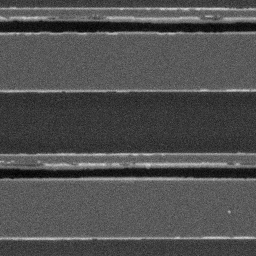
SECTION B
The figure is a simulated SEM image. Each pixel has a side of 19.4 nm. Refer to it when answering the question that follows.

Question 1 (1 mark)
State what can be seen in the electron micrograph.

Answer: lines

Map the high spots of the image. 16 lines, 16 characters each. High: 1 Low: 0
0000000000000000
1111111111111111
1111111111111111
1111111111111111
1111111111111111
1111111111111111
0000000000000000
0000000000000000
0000000000000000
0000000000000000
1111111111111111
1111111111111111
1111111111111111
1111111111111111
1111111111111111
0000000000000000